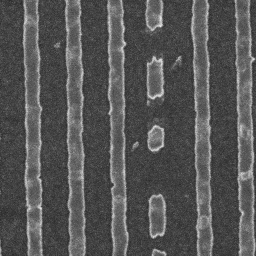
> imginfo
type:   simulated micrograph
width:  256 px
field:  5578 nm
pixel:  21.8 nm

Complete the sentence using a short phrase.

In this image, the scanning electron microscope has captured parallel lines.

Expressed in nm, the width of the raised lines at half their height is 316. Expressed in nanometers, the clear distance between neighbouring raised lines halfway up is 616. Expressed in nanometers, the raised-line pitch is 924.